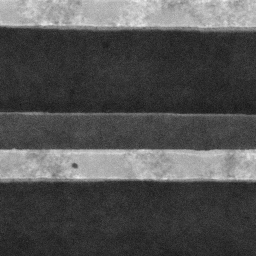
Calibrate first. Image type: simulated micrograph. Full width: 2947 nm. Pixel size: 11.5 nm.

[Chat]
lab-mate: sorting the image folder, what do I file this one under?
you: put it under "lines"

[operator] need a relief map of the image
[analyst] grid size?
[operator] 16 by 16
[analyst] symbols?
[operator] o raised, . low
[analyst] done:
oooooooooooooooo
oooooooooooooooo
................
................
................
................
................
................
................
oooooooooooooooo
oooooooooooooooo
................
................
................
................
................